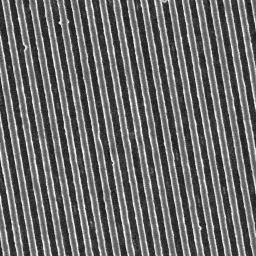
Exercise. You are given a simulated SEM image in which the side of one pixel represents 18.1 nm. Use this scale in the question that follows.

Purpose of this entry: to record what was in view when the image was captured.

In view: parallel lines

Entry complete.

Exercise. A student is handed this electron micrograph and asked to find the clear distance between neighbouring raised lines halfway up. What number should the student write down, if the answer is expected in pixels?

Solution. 7.03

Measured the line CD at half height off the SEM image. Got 125 nanometers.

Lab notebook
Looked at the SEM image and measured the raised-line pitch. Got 247 nm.